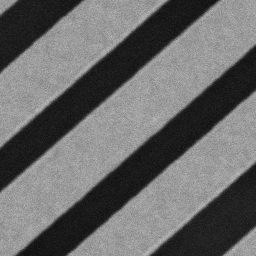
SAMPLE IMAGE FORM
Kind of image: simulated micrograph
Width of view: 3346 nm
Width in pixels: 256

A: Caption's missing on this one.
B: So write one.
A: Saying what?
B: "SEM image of lines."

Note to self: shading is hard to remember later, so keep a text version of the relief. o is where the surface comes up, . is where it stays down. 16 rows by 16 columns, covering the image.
.....ooooo...ooo
....ooooo...oooo
..oooooo...ooooo
.oooooo...ooooo.
ooooo....ooooo..
oooo....ooooo...
ooo...oooooo...o
oo...oooooo...oo
o...ooooo....ooo
...ooooo....oooo
..ooooo...oooooo
.ooooo...ooooo..
ooooo...ooooo...
oooo...ooooo....
ooo...ooooo.....
o....ooooo.....o